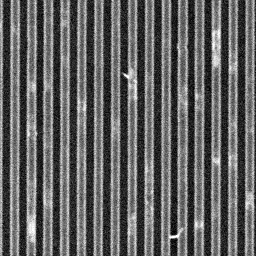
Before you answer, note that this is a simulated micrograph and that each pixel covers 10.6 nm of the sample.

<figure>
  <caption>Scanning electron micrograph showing parallel lines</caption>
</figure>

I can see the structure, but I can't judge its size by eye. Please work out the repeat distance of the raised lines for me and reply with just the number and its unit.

178 nm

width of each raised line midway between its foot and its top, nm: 90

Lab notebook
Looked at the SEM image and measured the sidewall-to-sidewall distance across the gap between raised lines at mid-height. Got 88.7 nm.